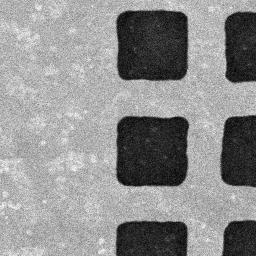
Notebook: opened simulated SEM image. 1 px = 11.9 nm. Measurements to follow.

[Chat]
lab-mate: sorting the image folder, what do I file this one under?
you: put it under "holes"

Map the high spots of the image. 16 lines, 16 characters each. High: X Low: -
XXXXXXXXXXXXXXXX
XXXXXXX-----XX--
XXXXXXX-----XX--
XXXXXXX-----XX--
XXXXXXX-----XX--
XXXXXXXXXXXXXXXX
XXXXXXXXXXXXXXXX
XXXXXXXX----XX--
XXXXXXX-----XX--
XXXXXXX-----XX--
XXXXXXX-----XX--
XXXXXXXX---XXX--
XXXXXXXXXXXXXXXX
XXXXXXXXXXXXXXXX
XXXXXXX-----XX--
XXXXXXX-----XX--